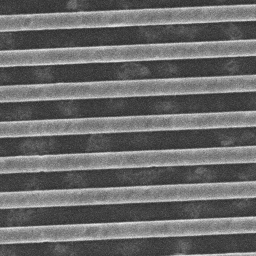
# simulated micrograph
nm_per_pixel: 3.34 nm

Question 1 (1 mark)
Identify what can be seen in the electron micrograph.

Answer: parallel lines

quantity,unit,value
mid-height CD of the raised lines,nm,52.5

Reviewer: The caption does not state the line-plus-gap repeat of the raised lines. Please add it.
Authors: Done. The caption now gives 0.118 micrometres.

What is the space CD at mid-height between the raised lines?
20.2 pixels